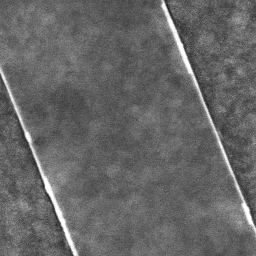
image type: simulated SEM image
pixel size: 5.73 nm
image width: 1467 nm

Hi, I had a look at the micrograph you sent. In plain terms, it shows one or a few lines or trenches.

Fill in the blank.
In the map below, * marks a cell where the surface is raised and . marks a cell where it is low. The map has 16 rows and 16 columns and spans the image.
***********.....
***********.....
***********.....
************....
************....
************....
.************...
.************...
..************..
..************..
..************..
...************.
...************.
....************
....************
....************